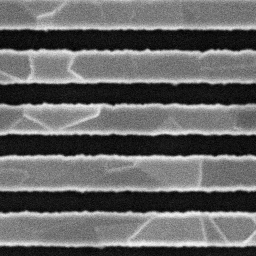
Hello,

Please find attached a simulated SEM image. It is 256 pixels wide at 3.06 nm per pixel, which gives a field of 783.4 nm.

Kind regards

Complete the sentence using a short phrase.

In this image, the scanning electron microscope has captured lines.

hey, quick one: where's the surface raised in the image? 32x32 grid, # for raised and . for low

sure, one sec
################################
################################
################################
################################
................................
................................
#########################.######
################################
################################
################################
#.........................#.....
................................
................................
################################
################################
################################
################################
................................
................................
.#.#####.######....##...##.##.##
################################
################################
################################
################################
................................
................................
...#......#.............#.......
################################
################################
################################
################################
................................